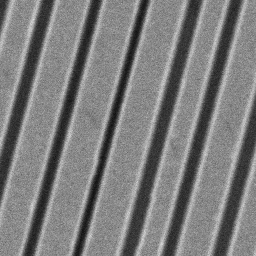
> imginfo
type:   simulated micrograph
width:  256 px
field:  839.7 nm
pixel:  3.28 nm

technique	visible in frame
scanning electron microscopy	parallel lines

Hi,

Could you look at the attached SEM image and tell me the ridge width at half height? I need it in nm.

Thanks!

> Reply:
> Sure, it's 114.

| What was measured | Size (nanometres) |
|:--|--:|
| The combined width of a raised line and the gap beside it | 150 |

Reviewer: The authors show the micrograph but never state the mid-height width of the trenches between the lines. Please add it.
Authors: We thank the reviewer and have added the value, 43.2 nm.